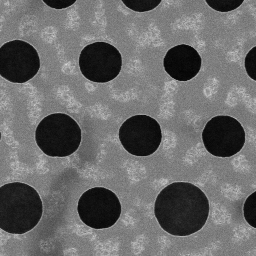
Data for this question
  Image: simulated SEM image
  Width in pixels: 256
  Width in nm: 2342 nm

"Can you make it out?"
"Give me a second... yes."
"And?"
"holes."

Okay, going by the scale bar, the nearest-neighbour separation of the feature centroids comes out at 752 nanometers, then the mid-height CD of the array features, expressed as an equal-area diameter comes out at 42.3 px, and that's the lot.